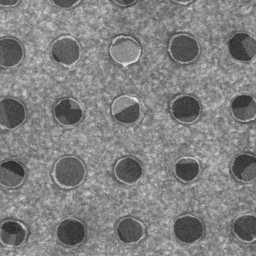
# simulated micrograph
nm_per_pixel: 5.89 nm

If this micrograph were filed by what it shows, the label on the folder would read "a regular array of raised bodies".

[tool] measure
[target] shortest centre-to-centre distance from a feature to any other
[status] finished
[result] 345 nm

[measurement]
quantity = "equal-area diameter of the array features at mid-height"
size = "174 nm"